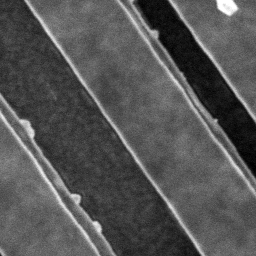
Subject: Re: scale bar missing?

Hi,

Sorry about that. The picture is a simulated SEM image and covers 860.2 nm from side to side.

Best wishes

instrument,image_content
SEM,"lines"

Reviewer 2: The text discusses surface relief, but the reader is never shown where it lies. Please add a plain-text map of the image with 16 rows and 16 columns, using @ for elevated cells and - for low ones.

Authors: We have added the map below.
--@@@@@@@--@@@@@
---@@@@@@---@@@@
---@@@@@@@--@@@@
----@@@@@@@--@@@
-----@@@@@@---@@
-----@@@@@@@--@@
------@@@@@@@--@
@------@@@@@@---
@@-----@@@@@@@--
@@@-----@@@@@@@-
@@@------@@@@@@-
@@@@------@@@@@@
@@@@@-----@@@@@@
@@@@@@-----@@@@@
@@@@@@------@@@@
@@@@@@@-----@@@@